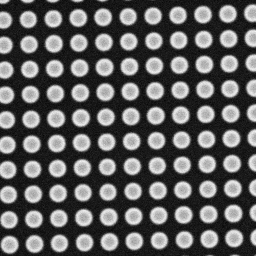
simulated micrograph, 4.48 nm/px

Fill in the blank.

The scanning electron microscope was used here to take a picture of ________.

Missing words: an array of small figures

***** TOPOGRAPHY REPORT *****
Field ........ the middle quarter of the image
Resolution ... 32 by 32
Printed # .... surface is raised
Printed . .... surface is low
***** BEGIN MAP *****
..####..####..####..#####..####.
..####..####..####...###...####.
..####...###...##...............
................................
................................
...##....###...###...###...####.
..####..####...####..####..####.
..####..####...####..####..####.
..####...###...###....##....##..
................................
................................
...##....###...###...####...###.
..####...###...####..####..####.
..####..#####..####..####..####.
..####...###...###....##....##..
....#...........................
................................
................##....##....###.
...###...####..####..####..####.
..####...####..####..####..####.
..####...####..####..####...###.
...##.....##....................
................................
.............................##.
...###...###...####..####...###.
...####..####..####..####..####.
...####..####..####..####...###.
...###....##....##..............
................................
.............................#..
....##....##....###...###...####
...####..####..####..#####..####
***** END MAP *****